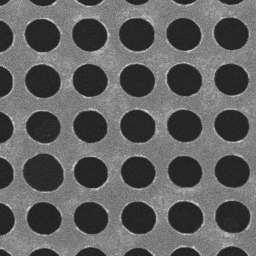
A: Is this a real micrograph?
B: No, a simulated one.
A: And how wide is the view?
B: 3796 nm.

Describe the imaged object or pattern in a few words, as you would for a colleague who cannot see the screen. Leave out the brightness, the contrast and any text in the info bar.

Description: a regular array of holes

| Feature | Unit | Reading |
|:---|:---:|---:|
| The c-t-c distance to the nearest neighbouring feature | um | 0.676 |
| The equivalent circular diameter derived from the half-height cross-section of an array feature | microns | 0.502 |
